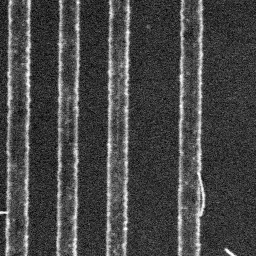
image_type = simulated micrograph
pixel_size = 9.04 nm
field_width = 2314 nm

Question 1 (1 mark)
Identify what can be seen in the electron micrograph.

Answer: lines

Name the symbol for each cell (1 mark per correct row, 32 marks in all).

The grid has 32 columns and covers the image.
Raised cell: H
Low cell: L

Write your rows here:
LHHHLLLLHHLLLLHHLLLLLLLHHLLLLLLL
LHHHLLLLHHLLLLHHLLLLLLLHHLLLLLLL
LHHHLLLLHHLLLLHHLLLLLLLHHLLLLLLL
LHHHLLLLHHLLLLHHLLLLLLLHHLLLLLLL
LHHHLLLLHHLLLLHHLLLLLLLHHLLLLLLL
LHHHLLLLHHLLLLHHLLLLLLLHHLLLLLLL
LHHHLLLLHHLLLLHHLLLLLLLHHLLLLLLL
LHHHLLLLHHLLLLHHLLLLLLLHHLLLLLLL
LHHHLLLLHHLLLLHHLLLLLLLHHLLLLLLL
LHHHLLLLHHLLLLHHLLLLLLLHHLLLLLLL
LHHHLLLLHHLLLLHHLLLLLLLHHLLLLLLL
LHHLLLLLHHLLLLHHLLLLLLLHHLLLLLLL
LHHHLLLLHHLLLLHHLLLLLLLHHLLLLLLL
LHHHLLLLHHLLLLHHLLLLLLLHHLLLLLLL
LHHHLLLLHHLLLLHHLLLLLLLHHLLLLLLL
LHHLLLLLHLLLLLHHLLLLLLLHHLLLLLLL
LHHLLLLLHLLLLLHHLLLLLLLHHLLLLLLL
LHHLLLLLHLLLLLHHLLLLLLLHHLLLLLLL
LHHLLLLHHHLLLLHHLLLLLLLHHLLLLLLL
LHHLLLLHHHLLLLHHLLLLLLLHHLLLLLLL
LHHLLLLHHHLLLLHHLLLLLLLHHLLLLLLL
LHHLLLLHHLLLLLHHLLLLLLLHHLLLLLLL
LHHLLLLHHLLLLLHHLLLLLLLHHLLLLLLL
LHHLLLLHHLLLLLHHLLLLLLLHHLLLLLLL
LHHLLLLHHLLLLLHHLLLLLLLHHLLLLLLL
LHHLLLLHHLLLLLHHLLLLLLLHHLLLLLLL
LHHLLLLHHLLLLLHHLLLLLLLHHLLLLLLL
LHHLLLLHHLLLLLHHLLLLLLHHHLLLLLLL
LHHLLLLHHLLLLLHHLLLLLLLHHLLLLLLL
LHHLLLLHHLLLLLHHLLLLLLHHHLLLLLLL
LHHLLLLHHLLLLLHHLLLLLLLHHLLLLLLL
LHHLLLLHHLLLLHHHLLLLLLHHHLLLLLLL